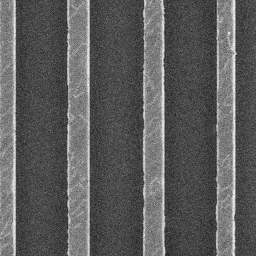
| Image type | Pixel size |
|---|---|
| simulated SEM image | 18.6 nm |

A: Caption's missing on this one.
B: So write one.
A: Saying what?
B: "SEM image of lines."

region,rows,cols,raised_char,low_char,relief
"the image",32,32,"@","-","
@@-------@@-------@@-------@@---
@@-------@@-------@@-------@@---
@@-------@@-------@@-------@@---
@@-------@@-------@@-------@@---
@@-------@@-------@@-------@@---
@@-------@@-------@@-------@@---
@@-------@@-------@@-------@@---
@@-------@@-------@@-------@@---
@@-------@@-------@@-------@@---
@@-------@@-------@@-------@@---
@@-------@@-------@@-------@@---
@@-------@@-------@@-------@@---
@@-------@@-------@@-------@@---
@@-------@@-------@@-------@@---
@@-------@@-------@@-------@@---
@@-------@@-------@@-------@@---
@@-------@@-------@@-------@@---
@@-------@@-------@@-------@@---
@@-------@@-------@@-------@@---
@@-------@@-------@@-------@@---
@@-------@@-------@@-------@@---
@@-------@@-------@@-------@@---
@@-------@@-------@@-------@@---
@@-------@@-------@@-------@@---
@@-------@@-------@@-------@@---
@@-------@@-------@@-------@@---
@@-------@@-------@@-------@@---
@@-------@@-------@@-------@@---
@@-------@@-------@@-------@@---
@@-------@@-------@@-------@@---
@@-------@@-------@@-------@@---
@@-------@@-------@@@------@@---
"